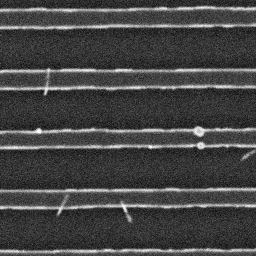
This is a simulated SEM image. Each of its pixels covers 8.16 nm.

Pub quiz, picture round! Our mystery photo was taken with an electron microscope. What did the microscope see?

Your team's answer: lines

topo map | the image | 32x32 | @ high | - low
--------------------------------
@@@@@@@@@@@@@@@@@@@@@@@@@@@@@@@@
@@@@@@@@@@@@@@@@@@@@@@@@@@@@@@@@
@@@-@@@@@-----------------------
--------------------------------
--------------------------------
--------------------------------
--------------------------------
--------------------------------
@@@@@@@@@@@@@@@@@@@@@@@@@@@@@@@@
@@@@@@@@@@@@@@@@@@@@@@@@@@@@@@@@
--------------------------------
--------------------------------
--------------------------------
--------------------------------
--------------------------------
@@@@@@@@@@@@@@@@@@@@@@@@@@@@@@@@
@@@@@@@@@@@@@@@@@@@@@@@@@@@@@@@@
@@@@@---------------------------
--------------------------------
--------------------------------
--------------------------------
--------------------------------
--------------------------------
@@@@@@@@@@@@@@@@@@@@@@@@@@@@@@@@
@@@@@@@@@@@@@@@@@@@@@@@@@@@@@@@@
--------------------------------
--------------------------------
--------------------------------
--------------------------------
--------------------------------
@@@@@@@@@@@@@@@@@@@@@@@@@@@@@@@@